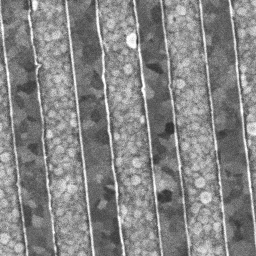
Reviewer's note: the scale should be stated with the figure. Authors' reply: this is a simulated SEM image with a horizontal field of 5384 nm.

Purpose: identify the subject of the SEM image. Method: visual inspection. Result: one or a few lines or trenches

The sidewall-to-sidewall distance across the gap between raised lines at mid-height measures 0.8 micrometres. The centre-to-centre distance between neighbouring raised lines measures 1400 nanometres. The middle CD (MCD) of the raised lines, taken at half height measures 617 nm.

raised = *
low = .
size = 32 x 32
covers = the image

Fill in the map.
****....****.....***.....****...
****....****.....***.....****...
****.....***.....***.....****...
****.....***.....****....****...
****.....***.....****....****...
.***.....****...*****.....***...
.***.....****....****.....***...
.****....****.....***.....****..
.****....****.....***.....****..
.****....****.....***.....****..
.****....****.....***.....****..
.****.....***.....***.....****..
.****.....***.....****....****..
.****.....***.....****....****..
.****.....****....****.....***..
..***.....****.....***.....***..
..***.....****.....***.....***.*
..***.....****.....***.....****.
..***.....****.....***.....****.
..****....****.....***.....****.
..****.....***.....***.....****.
..****.....***.....****....****.
..****.....***.....****....****.
..****.....****....****.....***.
..****.....****....****.....***.
...***.....****.....***.....****
...***.....****.....***.....****
...****....****.....***.....****
...****....****.....***.....****
...****....****.....***.....****
...****.....***.....****....****
...****.....***.....****....****